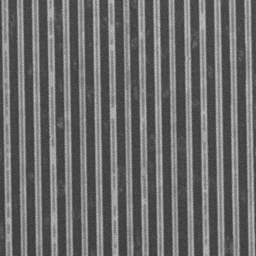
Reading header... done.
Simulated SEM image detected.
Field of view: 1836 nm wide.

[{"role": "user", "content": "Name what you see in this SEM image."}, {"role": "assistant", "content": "parallel lines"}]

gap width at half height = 76.2 nm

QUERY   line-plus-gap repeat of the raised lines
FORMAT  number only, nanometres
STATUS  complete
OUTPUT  109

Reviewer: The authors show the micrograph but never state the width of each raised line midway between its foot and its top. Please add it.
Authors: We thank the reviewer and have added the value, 34.1 nm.